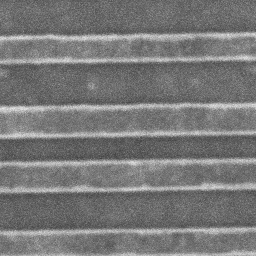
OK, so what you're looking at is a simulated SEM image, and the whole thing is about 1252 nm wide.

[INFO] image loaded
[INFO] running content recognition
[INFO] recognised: one or a few lines or trenches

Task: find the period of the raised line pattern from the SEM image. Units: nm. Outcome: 312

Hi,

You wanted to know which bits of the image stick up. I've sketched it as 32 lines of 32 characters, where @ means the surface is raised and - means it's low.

--------------------------------
--------------------------------
--------------------------------
--------------------------------
-----------------@------@@@@@@@@
@@@@@@@@@@@@@@@@@@@@@@@@@@@@@@@@
@@@@@@@@@@@@@@@@@@@@@@@@@@@@@@@@
@@@@@@@@@@@@@--@@@@-------------
--------------------------------
--------------------------------
--------------------------------
--------------------------------
--------------------------------
--------@@@@@@@@@@@@@@@@@@@@@@@@
@@@@@@@@@@@@@@@@@@@@@@@@@@@@@@@@
@@@@@@@@@@@@@@@@@@@@@@@@@@@@@@@@
@@@@@@@@@@@@@@@@@@@@@@@@@@@@@@@@
--------------------------------
--------------------------------
--------------------------------
--@@@@@@@@@@@@@@@@@@@@@@@@@@@@@@
@@@@@@@@@@@@@@@@@@@@@@@@@@@@@@@@
@@@@@@@@@@@@@@@@@@@@@@@@@@@@@@@@
@@@@@@@@@@@@@@@@@@@@@-----------
--------------------------------
--------------------------------
--------------------------------
--------------------------------
--------------------------------
@@@@@@@@@@@@@@@@@@@@@@@@@@@@@@@@
@@@@@@@@@@@@@@@@@@@@@@@@@@@@@@@@
@@@@@@@@@@@@@@@@@@@@@@@@@@@@@@@@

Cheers